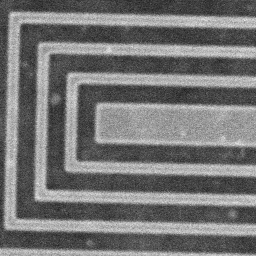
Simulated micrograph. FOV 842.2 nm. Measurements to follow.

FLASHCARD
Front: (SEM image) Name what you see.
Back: groups of lines, slits or small figures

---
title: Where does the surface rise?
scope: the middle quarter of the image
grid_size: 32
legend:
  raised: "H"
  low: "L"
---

LLLLLLLLLLLLLLLLLLLLLLLLLLLLLLLL
LLLLLLLLLLLLLLLLLLLLLLLLLLLLLLLL
LHHHHHHHHHHHHLLLLLLLLLLLLLLLLLLL
LHHHHHHHHHHHHHHHHHHHHHHHHHHHHHHH
LHHHHHHHHHHHHHHHHHHHHHHHHHHHHHHH
LHHLLLLLLLLLLLLLLLLLLLLLLLLLLLLL
LHHLLLLLLLLLLLLLLLLLLLLLLLLLLLLL
LHHLLLLLLLLLLLLLLLLLLLLLLLLLLLLL
LHHLLLLLLLLLLLLLLLLLLLLLLLLLLLLL
LHHLLLLLLLLLLLLLLLLLLLLLLLLLLLLL
LHHLLLLLHHHHHHHHHHHHHHHHHHHHHHHH
LHHLLLLLHHHHHHHHHHHHHHHHHHHHHHHH
LHHLLLLLHHHHHHHHHHHHHHHHHHHHHHHH
LHHLLLLLHHHHHHHHHHHHHHHHHHHHHHHH
LHHLLLLLHHHHHHHHHHHHHHHHHHHHHHHH
LHHLLLLLHHHHHHHHHHHHHHHHHHHHHHHH
LHHLLLLLHHHHHHHHHHHHHHHHHHHHHHHH
LHHLLLLLHHHHHHHHHHHHHHHHHHHHHHHH
LHHLLLLLHHHHHHHHHHHHHHHHHHHHHHHH
HHHLLLLLHHHHHHHHHHHHHHHHHHHHHHHH
HHHLLLLLLLLLLLLLLLLLLLLLLLLLLLLL
HHHLLLLLLLLLLLLLLLLLLLLLLLLLLLLL
HHHLLLLLLLLLLLLLLLLLLLLLLLLLLLLL
HHHLLLLLLLLLLLLLLLLLLLLLLLLLLLLL
HHHHLLLLLLLLLLLLLLLLLLLLLLLLLLLL
HHHHHHHHHHHHHHHHHHHHHHHHHHHHHHHH
HHHHHHHHHHHHHHHHHHHHHHHHHHHHHHHH
LLLLLLLLLLLLLLLLLLLLLLLLLLLLLLLL
LLLLLLLLLLLLLLLLLLLLLLLLLLLLLLLL
LLLLLLLLLLLLLLLLLLLLLLLLLLLLLLLL
LLLLLLLLLLLLLLLLLLLLLLLLLLLLLLLL
LLLLLLLLLLLLLLLLLLLLLLLLLLLLLLLL